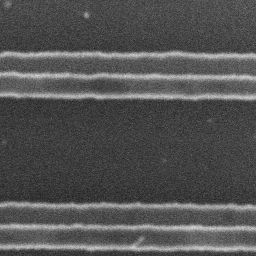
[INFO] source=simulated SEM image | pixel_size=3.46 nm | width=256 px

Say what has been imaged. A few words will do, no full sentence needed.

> lines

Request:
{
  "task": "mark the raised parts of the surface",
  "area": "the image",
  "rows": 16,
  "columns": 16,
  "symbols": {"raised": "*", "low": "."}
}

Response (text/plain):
................
................
................
****************
****************
****************
................
................
................
................
................
................
................
****************
****************
**.*.***********